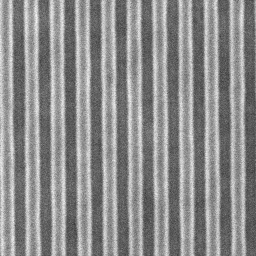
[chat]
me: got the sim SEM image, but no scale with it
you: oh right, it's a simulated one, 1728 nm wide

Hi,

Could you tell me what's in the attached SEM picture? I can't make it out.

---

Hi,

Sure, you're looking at wiring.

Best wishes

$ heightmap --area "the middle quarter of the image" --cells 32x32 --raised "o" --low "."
...ooo....ooo...ooo....oo....ooo
...ooo....ooo...ooo....oo....ooo
...ooo....ooo...ooo....oo....ooo
...ooo....ooo...ooo....oo....ooo
...ooo....ooo...ooo....oo....ooo
...ooo....ooo...ooo....oo....ooo
...ooo....ooo...ooo....oo....ooo
...ooo....ooo...ooo....oo....ooo
...ooo....ooo...ooo....ooo...ooo
...ooo....ooo...ooo....ooo...ooo
...ooo....ooo...ooo....ooo...ooo
...ooo....ooo...ooo....ooo...ooo
...ooo....ooo...ooo....ooo...ooo
...ooo....ooo...ooo....ooo...ooo
...ooo....ooo...ooo....ooo...ooo
...ooo....ooo...ooo....ooo...ooo
...ooo....ooo...ooo....ooo...ooo
...ooo....ooo...ooo....ooo...ooo
...ooo....ooo...ooo....ooo...ooo
...ooo....ooo...ooo....ooo...ooo
...ooo....ooo...ooo....ooo...ooo
....oo....ooo...ooo....ooo...ooo
....oo....ooo...ooo....ooo...ooo
....oo....ooo...ooo....ooo...ooo
....oo....ooo...ooo....ooo...ooo
....oo....ooo...ooo....ooo...ooo
....oo....ooo...ooo....ooo...ooo
....oo....ooo...ooo....ooo...ooo
....oo....ooo...ooo....ooo...ooo
....oo....ooo...ooo....ooo...ooo
....oo....ooo...ooo....ooo...ooo
....ooo...ooo...ooo....ooo...ooo